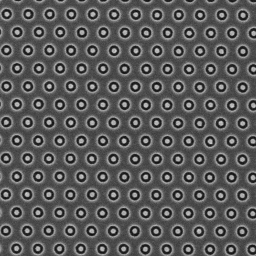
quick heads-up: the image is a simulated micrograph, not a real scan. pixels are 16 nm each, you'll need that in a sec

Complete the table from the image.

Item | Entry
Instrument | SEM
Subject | a regular array of ring-shaped grooves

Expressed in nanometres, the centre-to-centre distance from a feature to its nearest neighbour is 331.